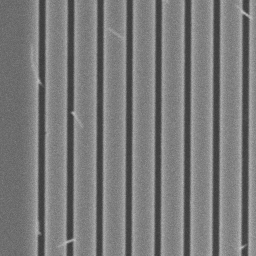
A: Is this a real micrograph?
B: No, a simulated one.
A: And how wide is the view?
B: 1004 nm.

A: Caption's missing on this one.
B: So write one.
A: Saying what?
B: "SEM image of parallel lines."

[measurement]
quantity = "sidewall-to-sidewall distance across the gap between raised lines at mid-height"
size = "26.4 nanometres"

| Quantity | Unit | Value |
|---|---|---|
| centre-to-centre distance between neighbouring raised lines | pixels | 29.1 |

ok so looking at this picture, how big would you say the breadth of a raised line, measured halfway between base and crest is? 86.2 nm